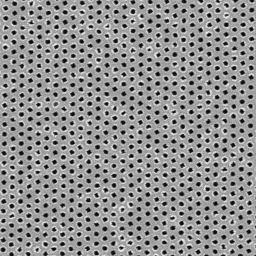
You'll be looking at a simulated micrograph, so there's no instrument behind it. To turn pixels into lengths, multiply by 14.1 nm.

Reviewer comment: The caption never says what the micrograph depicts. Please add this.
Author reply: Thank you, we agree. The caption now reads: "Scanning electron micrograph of a regular array of holes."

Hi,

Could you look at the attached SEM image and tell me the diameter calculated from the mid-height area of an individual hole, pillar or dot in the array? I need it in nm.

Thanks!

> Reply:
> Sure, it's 67.5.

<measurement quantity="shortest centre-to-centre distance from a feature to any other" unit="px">9.27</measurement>